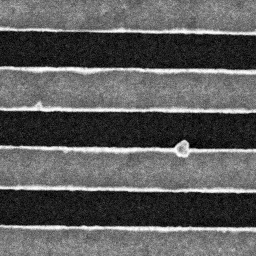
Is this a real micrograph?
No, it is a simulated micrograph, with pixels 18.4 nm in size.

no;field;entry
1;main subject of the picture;lines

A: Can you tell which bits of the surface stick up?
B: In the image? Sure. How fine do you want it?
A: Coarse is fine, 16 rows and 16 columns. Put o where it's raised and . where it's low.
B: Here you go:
oooooooooooooooo
oooooooooooooooo
................
................
oooooooooooooooo
oooooooooooooooo
oooooooooooooooo
................
................
oooooooooooooooo
oooooooooooooooo
oooooooooooooooo
................
................
oooooooooooooooo
oooooooooooooooo